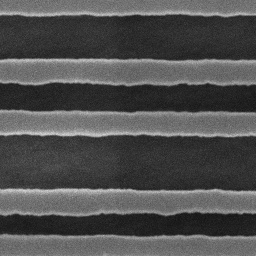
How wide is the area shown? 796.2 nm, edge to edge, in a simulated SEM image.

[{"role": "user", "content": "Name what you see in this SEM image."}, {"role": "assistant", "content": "lines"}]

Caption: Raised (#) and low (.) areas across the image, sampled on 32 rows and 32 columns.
################################
################################
................................
................................
................................
................................
................................
###############.####.....##.....
################################
################################
..####.....#####################
................................
................................
................................
################################
################################
################################
................................
................................
................................
................................
................................
................................
................................
################################
################################
################################
................................
................................
########....###.....#.#.##......
################################
################################